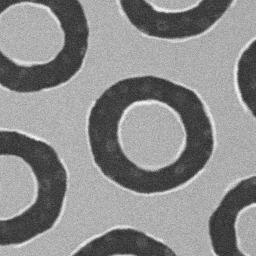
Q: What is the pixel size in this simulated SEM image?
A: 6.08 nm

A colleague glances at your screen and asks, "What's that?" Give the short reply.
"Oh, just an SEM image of ring-shaped grooves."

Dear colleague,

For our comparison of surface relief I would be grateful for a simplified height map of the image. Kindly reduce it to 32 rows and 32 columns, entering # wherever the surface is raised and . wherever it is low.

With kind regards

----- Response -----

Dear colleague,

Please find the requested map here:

..##......#####....######....###
######.....#####....##......####
#######....#####...........#####
########...######.........######
########...########.....########
########...####################.
#######....###################..
..####....####################..
..........####################..
.........#########.###########..
........######........########..
##..#########...........######..
############.............#####..
############....#####.....#####.
###########....#######....######
###########....########...######
..#########....########....#####
.....######....########....#####
......#####....########....#####
##.....#####....######....######
###.....####.....####.....######
####....#####............#######
#####...######..........######..
#####...########......#######...
#####...####################....
####....###################....#
###.....###################...##
#......###################...###
......#########.##########...###
.....########......#######....##
...########..........#####....##
##########............#####...##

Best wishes